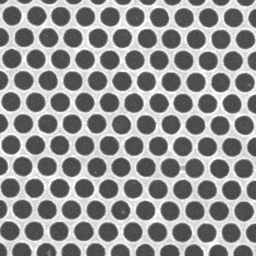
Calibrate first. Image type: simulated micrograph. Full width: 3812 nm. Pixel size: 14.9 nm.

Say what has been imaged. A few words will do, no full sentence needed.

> a regular array of holes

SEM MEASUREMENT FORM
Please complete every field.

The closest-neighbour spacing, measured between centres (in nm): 362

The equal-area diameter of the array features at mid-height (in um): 0.301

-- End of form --